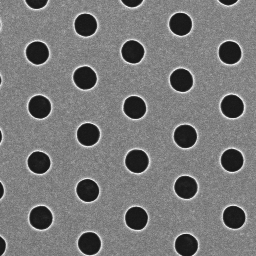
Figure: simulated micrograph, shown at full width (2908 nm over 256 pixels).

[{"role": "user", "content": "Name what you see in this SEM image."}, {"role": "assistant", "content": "a regular array of holes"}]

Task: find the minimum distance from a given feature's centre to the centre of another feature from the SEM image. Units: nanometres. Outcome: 612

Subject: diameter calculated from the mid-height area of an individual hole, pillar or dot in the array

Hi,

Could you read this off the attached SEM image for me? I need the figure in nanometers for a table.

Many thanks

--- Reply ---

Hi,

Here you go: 257